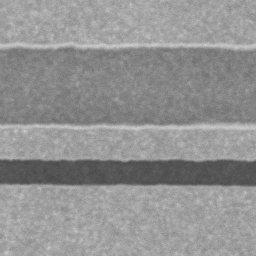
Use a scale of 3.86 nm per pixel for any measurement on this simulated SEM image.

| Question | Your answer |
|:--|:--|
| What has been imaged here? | lines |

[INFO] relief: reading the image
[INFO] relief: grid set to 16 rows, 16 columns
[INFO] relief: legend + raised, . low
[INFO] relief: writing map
++++++++++++++++
++++++++++++++++
++++++++++++++++
................
................
................
................
................
++++++++++++++++
++++++++++++++++
................
................
++++++++++++++++
++++++++++++++++
++++++++++++++++
++++++++++++++++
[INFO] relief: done